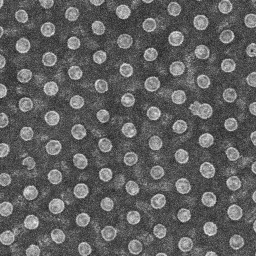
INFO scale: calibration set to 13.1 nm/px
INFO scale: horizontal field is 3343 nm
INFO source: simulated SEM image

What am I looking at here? a regular array of raised bodies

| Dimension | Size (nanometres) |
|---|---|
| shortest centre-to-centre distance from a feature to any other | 379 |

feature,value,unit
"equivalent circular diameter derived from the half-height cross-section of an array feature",0.17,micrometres